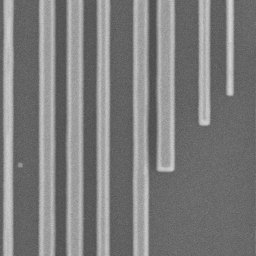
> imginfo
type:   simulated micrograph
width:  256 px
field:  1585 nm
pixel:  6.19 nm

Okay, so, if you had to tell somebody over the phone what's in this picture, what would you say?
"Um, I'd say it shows groups of lines, slits or small figures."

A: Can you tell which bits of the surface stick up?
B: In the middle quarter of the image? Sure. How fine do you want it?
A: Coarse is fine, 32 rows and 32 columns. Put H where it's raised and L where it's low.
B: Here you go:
LHHHLLLLLHHLLLLLLLHHHLLLHHHLLLLL
LHHHLLLLLHHLLLLLLLHHHLLLHHHLLLLL
LHHHLLLLLHHLLLLLLLHHHLLLHHHLLLLL
LHHHLLLLLHHLLLLLLLHHHLLLHHHLLLLL
LHHHLLLLLHHLLLLLLLHHHLLLHHHLLLLL
LHHHLLLLLHHLLLLLLLHHHLLLHHHLLLLL
LHHHLLLLLHHLLLLLLLHHHLLLHHHLLLLL
LHHHLLLLLHHLLLLLLLHHHLLLHHHLLLLL
LHHHLLLLLHHLLLLLLLHHHLLLHHHLLLLL
LHHHLLLLLHHLLLLLLLHHHLLLHHHLLLLL
LHHHLLLLLHHLLLLLLLHHHLLLHHHLLLLL
LHHHLLLLLHHLLLLLLLHHHLLLHHHLLLLL
LHHHLLLLLHHLLLLLLLHHHLLLHHHLLLLL
LHHHLLLLLHHLLLLLLLHHHLLLHHHLLLLL
LHHHLLLLLHHLLLLLLLHHHLLLHHHLLLLL
LHHHLLLLLHHLLLLLLLHHHLLLHHHLLLLL
LHHHLLLLLHHLLLLLLLHHHLLLHHHLLLLL
LHHHLLLLLHHLLLLLLLHHHLLLHHHLLLLL
LHHHLLLLLHHLLLLLLLHHHLLLHHHLLLLL
LHHHLLLLLHHLLLLLLLHHHLLLHHHLLLLL
LHHHLLLLLHHLLLLLLLHHHLLLHHHLLLLL
LHHHLLLLLHHLLLLLLLHHHLLLHHHLLLLL
LHHHLLLLLHHLLLLLLLHHHLLLHHHLLLLL
LHHHLLLLLHHLLLLLLLHHHLLLHHHLLLLL
LHHHLLLLLHHLLLLLLLHHHLLLHHHLLLLL
LHHHLLLLLHHLLLLLLLHHHLLLHHHLLLLL
LHHHLLLLLHHLLLLLLLHHHLLLLLLLLLLL
LHHHLLLLLHHLLLLLLLHHHLLLLLLLLLLL
LHHHLLLLLHHLLLLLLLHHHLLLLLLLLLLL
LHHHLLLLLHHLLLLLLLHHHLLLLLLLLLLL
LHHHLLLLLHHLLLLLLLHHHLLLLLLLLLLL
LHHHLLLLLHHLLLLLLLHHHLLLLLLLLLLL